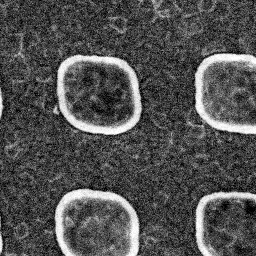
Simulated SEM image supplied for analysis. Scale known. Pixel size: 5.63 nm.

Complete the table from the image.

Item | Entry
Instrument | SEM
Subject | raised bodies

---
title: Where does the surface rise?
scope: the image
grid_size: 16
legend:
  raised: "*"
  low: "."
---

................
................
................
................
....****....****
....*****...****
....*****...****
....****.....***
................
................
................
................
....****.....***
....****....****
....****....****
....****.....***